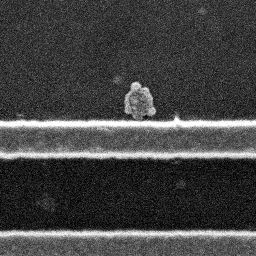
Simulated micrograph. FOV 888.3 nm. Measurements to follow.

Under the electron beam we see one or a few lines or trenches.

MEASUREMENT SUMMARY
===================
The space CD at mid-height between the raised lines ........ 265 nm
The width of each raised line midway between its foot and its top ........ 116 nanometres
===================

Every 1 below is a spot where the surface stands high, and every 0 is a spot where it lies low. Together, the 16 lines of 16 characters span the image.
0000000000000000
0000000000000000
0000000000000000
0000000000000000
0000000000000000
0000000000000000
0000000000000000
0000000000000000
1111111111111111
1111111111111111
0000000000000000
0000000000000000
0000000000000000
0000000000000000
0000000000000100
1111111111111111